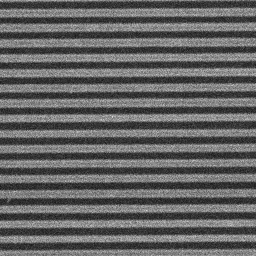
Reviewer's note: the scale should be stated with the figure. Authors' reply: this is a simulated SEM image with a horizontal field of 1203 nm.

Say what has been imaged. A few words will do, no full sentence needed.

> parallel lines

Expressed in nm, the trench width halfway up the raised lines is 36.4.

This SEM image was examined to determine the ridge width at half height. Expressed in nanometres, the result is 31.7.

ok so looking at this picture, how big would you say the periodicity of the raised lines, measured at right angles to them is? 70.8 nanometers